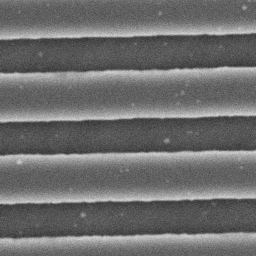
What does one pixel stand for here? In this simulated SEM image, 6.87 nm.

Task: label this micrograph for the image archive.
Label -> lines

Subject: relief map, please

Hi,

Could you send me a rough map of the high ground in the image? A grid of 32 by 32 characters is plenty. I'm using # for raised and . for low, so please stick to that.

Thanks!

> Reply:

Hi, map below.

################################
################################
################################
################################
#################...............
................................
................................
................................
...........................#####
################################
################################
################################
################################
################################
###########################.....
................................
................................
................................
................................
.###############################
################################
################################
################################
################################
################################
................................
................................
................................
................................
..................##############
################################
################################